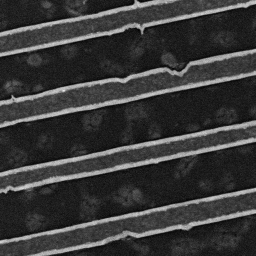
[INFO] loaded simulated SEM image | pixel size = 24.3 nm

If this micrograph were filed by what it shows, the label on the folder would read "one or a few lines or trenches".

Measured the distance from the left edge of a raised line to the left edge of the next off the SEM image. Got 67.8 px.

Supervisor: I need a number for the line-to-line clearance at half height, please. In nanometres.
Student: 1170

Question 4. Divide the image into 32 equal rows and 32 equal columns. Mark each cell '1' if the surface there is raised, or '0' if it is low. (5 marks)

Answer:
00000000000000000011111111111110
00000000000000111111111111000000
00000000011111111111100000000000
00001111111111110000000000000000
11111111111000000000000000000000
11111110000000000000000000000000
11000000000000000000000000000001
00000000000000000000000000111111
00000000000000000000000111111111
00000000000000000111111111111100
00000000000111111111111110000000
00000011111111111111000000000000
00111111111111110000000000000000
11111111111000000000000000000000
11111000000000000000000000000000
10000000000000000000000000000001
00000000000000000000000000111111
00000000000000000000011111111111
00000000000000001111111111100000
00000000000111111111110000000000
00000011111111111100000000000000
01111111111100000000000000000000
11111110000000000000000000000000
11100000000000000000000000000000
00000000000000000000000000001111
00000000000000000000000111111111
00000000000000000011111111111111
00000000000000111111111111100000
00000000011111111111110000000000
00001111111111100000000000000000
11111111111100000000000000000000
11111110000000000000000000000000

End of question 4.